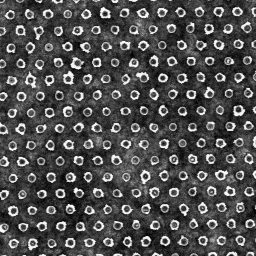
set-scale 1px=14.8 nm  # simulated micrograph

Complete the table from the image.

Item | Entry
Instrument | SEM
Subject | a regular array of raised bodies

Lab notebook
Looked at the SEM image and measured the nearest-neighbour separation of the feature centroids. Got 270 nm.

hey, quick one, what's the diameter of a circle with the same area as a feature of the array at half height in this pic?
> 135 nanometers